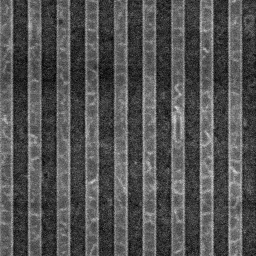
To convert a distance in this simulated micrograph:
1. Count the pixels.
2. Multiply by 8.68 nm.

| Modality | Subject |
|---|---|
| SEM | parallel lines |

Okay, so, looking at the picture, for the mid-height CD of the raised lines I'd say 104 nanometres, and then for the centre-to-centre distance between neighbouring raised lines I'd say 28.6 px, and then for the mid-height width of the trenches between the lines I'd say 0.141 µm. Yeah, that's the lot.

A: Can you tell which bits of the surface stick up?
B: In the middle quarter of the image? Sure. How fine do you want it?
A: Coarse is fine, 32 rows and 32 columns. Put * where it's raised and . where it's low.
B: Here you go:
*.....**.....***....***....***..
*.....**.....***....***....***..
*.....**.....***....***....***..
*.....**.....***....***....***..
*.....**.....***....***....***..
*.....**.....***....***....***..
*.....**.....***....***....***..
*.....**.....***....***....***..
*.....**.....***....***....***..
*.....**.....***....***....***..
*.....**.....***....***....***..
*.....**.....**.....***....***..
*.....**.....**.....***....***..
*.....**.....**.....***....***..
*.....**.....**.....***....***..
*.....**.....**.....***....***..
*.....**.....***....***....***..
*.....**.....***....***....***..
*.....**.....***....***....***..
*.....**.....***....***....***..
*.....**.....***....***....***..
*.....**.....***....***....***..
*.....**.....***....***....***..
*.....**.....***....***....***..
*.....**.....***....***....***..
*.....**.....***....***....***..
*.....**.....***....***....***..
*.....**.....***....***....***..
*.....**.....***....***....***..
*.....**.....***....***....*.*..
*.....**.....***....***....***..
*.....**.....***....***....***..